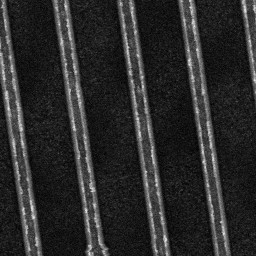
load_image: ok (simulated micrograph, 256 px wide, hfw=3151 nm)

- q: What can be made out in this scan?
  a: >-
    one or a few lines or trenches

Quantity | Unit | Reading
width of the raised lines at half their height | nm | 158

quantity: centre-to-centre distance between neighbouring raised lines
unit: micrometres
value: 0.765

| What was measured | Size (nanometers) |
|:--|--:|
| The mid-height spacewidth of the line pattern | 606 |